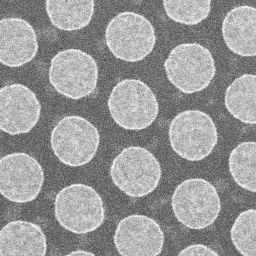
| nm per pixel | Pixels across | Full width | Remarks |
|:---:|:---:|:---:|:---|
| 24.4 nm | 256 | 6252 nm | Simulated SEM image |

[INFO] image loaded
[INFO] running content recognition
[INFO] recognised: a regular array of raised bodies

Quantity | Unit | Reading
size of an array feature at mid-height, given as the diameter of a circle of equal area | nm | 1170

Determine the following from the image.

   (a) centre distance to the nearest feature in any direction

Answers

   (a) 67.4 pixels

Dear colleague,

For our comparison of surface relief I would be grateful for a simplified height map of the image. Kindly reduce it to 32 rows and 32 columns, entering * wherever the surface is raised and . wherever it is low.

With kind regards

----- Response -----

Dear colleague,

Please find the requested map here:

......******.........*****......
......*****..........*****...***
**....*****...****....***...****
****....**....*****.........****
****.........******.........****
*****.........*****.........****
****....**....*****...****....**
****...*****....*....******.....
......******.........******.....
......******.........******....*
.......*****...***....****...***
****....***...*****....*....****
*****.........*****.........****
*****.........******........****
*****.........*****...****...***
****...****....****..******.....
.**....*****.........******.....
......******.........******.....
.......*****....*.....*****...**
.***...*****...****....***...***
*****....*....******.........***
*****.........******.........***
*****.........******....*....***
*****...***....****...*****....*
.***...*****..........*****.....
.......******.........*****.....
.......******.........*****....*
.......******..****...*****...**
.****...****...*****.........***
*****.........******.........***
******.........*****.........***
******.........*****...****...**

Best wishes